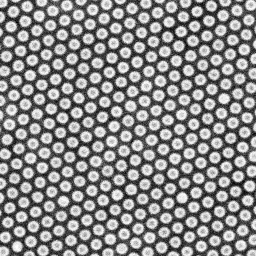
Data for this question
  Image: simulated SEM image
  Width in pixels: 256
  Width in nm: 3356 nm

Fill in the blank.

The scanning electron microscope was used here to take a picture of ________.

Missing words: a regular array of raised bodies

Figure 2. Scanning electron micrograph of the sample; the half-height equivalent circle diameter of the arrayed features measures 0.126 µm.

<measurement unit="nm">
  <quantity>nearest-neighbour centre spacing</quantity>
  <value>192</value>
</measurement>